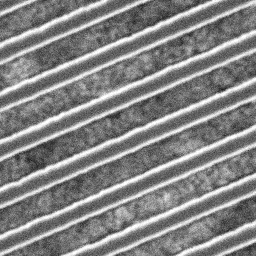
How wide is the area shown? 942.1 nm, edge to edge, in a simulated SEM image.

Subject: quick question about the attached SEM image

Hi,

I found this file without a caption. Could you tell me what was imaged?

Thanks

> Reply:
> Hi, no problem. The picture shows lines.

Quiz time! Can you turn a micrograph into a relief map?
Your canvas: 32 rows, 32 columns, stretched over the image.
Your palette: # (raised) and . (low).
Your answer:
###.........#####.........######
#........######........######...
.......######........######.....
.....#####.........#####........
..######.........#####........##
######........######........####
###.........#####.........######
#........######........######...
.......######........######.....
.....#####.........######.......
..######........######........##
######........######........####
###.........#####.........#####.
#.........#####.........#####...
.......######........######.....
.....######........#####........
...#####........######........##
######........######........####
####........#####........######.
#.........#####........######...
.......######........######.....
.....#####.........#####........
...#####........######........##
######........######........####
####........######.......######.
#........######........######...
.......######........######.....
....######.........#####........
..######........######........##
######........######........####
###.........#####.........#####.
#........######........######...